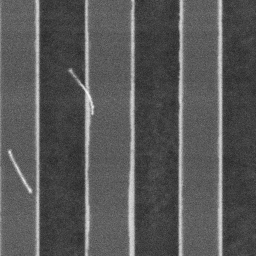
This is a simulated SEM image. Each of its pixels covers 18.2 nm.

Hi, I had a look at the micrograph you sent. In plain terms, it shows lines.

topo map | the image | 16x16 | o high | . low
oo...ooo...ooo..
oo...ooo...ooo..
oo...ooo...ooo..
oo...ooo...ooo..
oo...ooo...ooo..
oo...ooo...ooo..
oo...ooo...ooo..
oo...ooo...ooo..
oo...ooo...ooo..
oo...ooo...ooo..
oo...ooo...ooo..
oo...ooo...ooo..
oo...ooo...ooo..
oo...ooo...ooo..
oo...ooo...ooo..
oo...ooo...ooo..